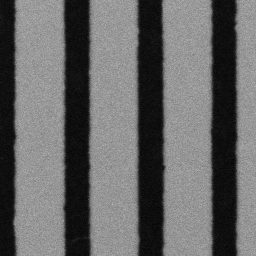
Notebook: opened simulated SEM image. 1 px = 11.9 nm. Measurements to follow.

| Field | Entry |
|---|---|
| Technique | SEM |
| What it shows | one or a few lines or trenches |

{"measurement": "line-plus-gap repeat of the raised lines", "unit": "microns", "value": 0.876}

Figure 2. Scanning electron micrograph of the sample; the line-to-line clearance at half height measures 558 nm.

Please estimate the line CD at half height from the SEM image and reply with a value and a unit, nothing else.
27.1 pixels